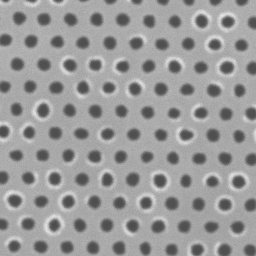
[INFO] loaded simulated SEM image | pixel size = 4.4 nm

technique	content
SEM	a regular array of holes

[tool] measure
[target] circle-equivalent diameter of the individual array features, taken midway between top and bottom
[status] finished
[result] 57.9 nm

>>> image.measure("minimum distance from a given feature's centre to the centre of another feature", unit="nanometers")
113